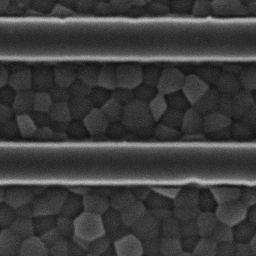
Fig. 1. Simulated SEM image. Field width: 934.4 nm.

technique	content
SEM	one or a few lines or trenches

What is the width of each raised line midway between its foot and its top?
144 nanometres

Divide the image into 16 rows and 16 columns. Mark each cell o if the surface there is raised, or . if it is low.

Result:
................
oooooooooooooooo
oooooooooooooooo
oooooooooooooooo
................
................
................
................
................
oooooooooooooooo
oooooooooooooooo
................
................
................
................
................